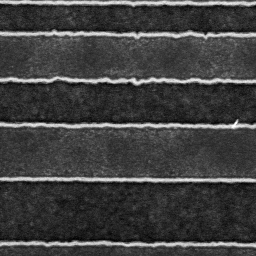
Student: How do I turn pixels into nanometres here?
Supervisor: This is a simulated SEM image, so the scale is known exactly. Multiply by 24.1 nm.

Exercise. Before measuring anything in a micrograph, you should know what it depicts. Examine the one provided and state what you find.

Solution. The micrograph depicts one or a few lines or trenches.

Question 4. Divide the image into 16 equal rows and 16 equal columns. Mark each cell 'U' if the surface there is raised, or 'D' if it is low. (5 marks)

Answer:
DDDDDDDDDDDDDDDD
DDDDDDDDDDDDDDDD
UUUUUUUUUUUUUUUU
UUUUUUUUUUUUUUUU
UUUUUUUUUUUUUUUU
DDDDDDDDDDDDDDDD
DDDDDDDDDDDDDDDD
DDDDDDDDDDDDDDDD
UUUUUUUUUUUUUUUU
UUUUUUUUUUUUUUUU
UUUUUUUUUUUUUUUU
DDDDDDDDDDDDDDDD
DDDDDDDDDDDDDDDD
DDDDDDDDDDDDDDDD
DDDDDDDDDDDDDDDD
UUUUUUUUUUUUUUUU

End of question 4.